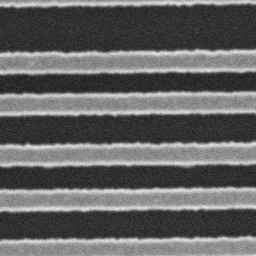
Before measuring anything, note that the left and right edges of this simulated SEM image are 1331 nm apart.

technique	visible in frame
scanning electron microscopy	lines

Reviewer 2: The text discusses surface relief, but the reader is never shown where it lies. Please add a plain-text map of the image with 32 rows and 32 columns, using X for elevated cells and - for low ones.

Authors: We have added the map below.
XXXXXXXXXXXXXXXXXXXXX-XX---X----
--------------------------------
--------------------------------
--------------------------------
--------------------------------
--------------------------------
-----------X--XXXXXXXXXXXXXXXXXX
XXXXXXXXXXXXXXXXXXXXXXXXXXXXXXXX
XXXXXXXXXXXXXXXXXXXXXXXXXXXXXXXX
--------------------------------
--------------------------------
--------------------------------
XXXXXXXXXXXXXXXXXXXXXXXXXXXXXXXX
XXXXXXXXXXXXXXXXXXXXXXXXXXXXXXXX
--------------------------------
--------------------------------
--------------------------------
--------------------------------
XXXXXXXXXXXXXXXXXXXXXXXXXXXXXXXX
XXXXXXXXXXXXXXXXXXXXXXXXXXXXXXXX
XXXXXXXXXXXXXXXXXXXXXXXXXX---XX-
--------------------------------
--------------------------------
----------------------------X---
XXXXXXXXXXXXXXXXXXXXXXXXXXXXXXXX
XXXXXXXXXXXXXXXXXXXXXXXXXXXXXXXX
--------------------------------
--------------------------------
--------------------------------
--------------------------------
XXXXXXXXXXXXXXXXXXXXXXXXXXXXXXXX
XXXXXXXXXXXXXXXXXXXXXXXXXXXXXXXX